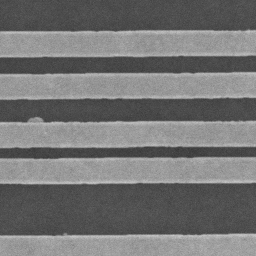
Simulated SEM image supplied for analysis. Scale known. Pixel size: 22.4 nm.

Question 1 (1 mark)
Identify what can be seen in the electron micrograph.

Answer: lines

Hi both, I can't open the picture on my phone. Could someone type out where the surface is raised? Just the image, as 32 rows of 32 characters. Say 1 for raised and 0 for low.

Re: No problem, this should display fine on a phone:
00000000000000000000000000000000
00000000000000000000000000000000
00000000000000000000000000000000
00000000000000000000000000000000
11111111111111111111111111111111
11111111111111111111111111111111
11111111111111111111111111111111
00000000000000000000000000000000
00000000000000000000000000000000
11111111111111111111111111111111
11111111111111111111111111111111
11111111111111111111111111111111
00000000000000000000000000000000
00000000000000000000000000000000
00000000000000000000000000000000
11111111111111111111111111111111
11111111111111111111111111111111
11111111111111111111111111111111
00000000000000000000000000000000
00000000000000000000000000000000
11111111111111111111111111111111
11111111111111111111111111111111
11111111111111111111111111111111
00000000000000000000000000000000
00000000000000000000000000000000
00000000000000000000000000000000
00000000000000000000000000000000
00000000000000000000000000000000
00000000000000000000000000000000
00000000000000001111111111111111
11111111111111111111111111111111
11111111111111111111111111111111